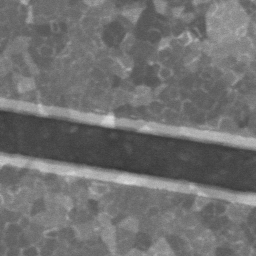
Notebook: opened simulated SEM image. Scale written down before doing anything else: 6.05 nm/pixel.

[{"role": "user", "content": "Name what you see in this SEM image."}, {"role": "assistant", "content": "one or a few lines or trenches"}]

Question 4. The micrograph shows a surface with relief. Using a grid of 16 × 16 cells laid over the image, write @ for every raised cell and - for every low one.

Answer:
@@@@@@@@@@@@@@@@
@@@@@@@@@@@@@@@@
@@@@@@@@@@@@@@@@
@@@@@@@@@@@@@@@@
@@@@@@@@@@@@@@@@
@@@@@@@@@@@@@@@@
-@@@@@@@@@@@@@@@
-------@@@@@@@@@
--------------@@
----------------
@@@-------------
@@@@@@@@@-------
@@@@@@@@@@@@@@@@
@@@@@@@@@@@@@@@@
@@@@@@@@@@@@@@@@
@@@@@@@@@@@@@@@@